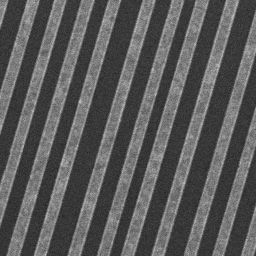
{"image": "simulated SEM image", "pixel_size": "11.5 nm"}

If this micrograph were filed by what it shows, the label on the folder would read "parallel lines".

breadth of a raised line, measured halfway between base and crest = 119 nanometers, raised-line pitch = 320 nm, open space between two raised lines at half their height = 193 nm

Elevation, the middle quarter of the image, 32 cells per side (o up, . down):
ooo....oo......ooo....ooo...ooo.
oo....ooo......oo.....ooo...ooo.
oo....ooo.....ooo.....oo....ooo.
oo....oo......ooo....ooo...ooo..
o....ooo......ooo....ooo...ooo..
o....ooo......oo.....oo....ooo..
o....oo......ooo.....oo....oo...
o...ooo......ooo....ooo...ooo...
....ooo......oo.....ooo...ooo...
....ooo.....ooo.....oo....ooo...
....oo......ooo....ooo...ooo....
...ooo......oo.....ooo...ooo....
...ooo......oo.....oo....ooo....
...oo......ooo.....oo....oo.....
..ooo......ooo....ooo...ooo.....
..ooo......ooo....ooo...ooo.....
..oo......ooo.....oo....ooo....o
..oo......ooo....ooo...ooo.....o
.ooo......ooo....ooo...ooo.....o
.ooo.....ooo.....oo....ooo....oo
.oo......ooo....ooo....oo.....oo
ooo......ooo....ooo...ooo.....oo
ooo......oo.....ooo...ooo....ooo
oo......ooo.....oo....ooo....ooo
oo......ooo....ooo...ooo.....oo.
oo......ooo....ooo...ooo.....oo.
oo.....ooo.....oo....ooo....ooo.
o......ooo....ooo...ooo.....ooo.
o......ooo....ooo...ooo.....oo..
o......oo.....oo....ooo....ooo..
......ooo.....oo....oo.....ooo..
......ooo....ooo...ooo.....oo...